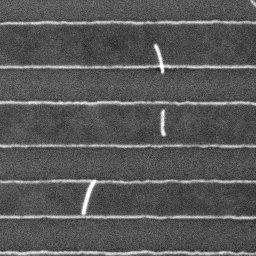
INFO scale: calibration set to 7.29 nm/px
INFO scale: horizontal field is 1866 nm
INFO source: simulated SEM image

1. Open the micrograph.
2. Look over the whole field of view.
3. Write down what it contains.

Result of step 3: lines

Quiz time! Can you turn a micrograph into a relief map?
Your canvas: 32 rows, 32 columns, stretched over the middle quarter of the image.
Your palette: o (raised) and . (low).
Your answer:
oooooooooooooooooooooooooooooooo
................................
................................
................................
................................
................................
................................
................................
................................
................................
oooooooooooooooooooooooooooooooo
oooooooooooooooooooooooooooooooo
oooooooooooooooooooooooooooooooo
oooooooooooooooooooooooooooooooo
oooooooooooooooooooooooooooooooo
oooooooooooooooooooooooooooooooo
oooooooooooooooooooooooooooooooo
oooooooooooooooooooooooooooooooo
oooooooooooooooooooooooooooooooo
oooooooooooooooooooooooooooooooo
.............oooooooo.ooo......o
................................
................................
................................
................................
................................
................................
................................
................................
ooooooooooooooo..oo.oooooooooooo
oooooooooooooooooooooooooooooooo
oooooooooooooooooooooooooooooooo